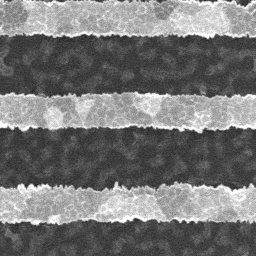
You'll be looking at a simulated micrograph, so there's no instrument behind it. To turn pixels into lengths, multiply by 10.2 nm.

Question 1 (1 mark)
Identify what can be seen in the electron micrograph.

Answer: one or a few lines or trenches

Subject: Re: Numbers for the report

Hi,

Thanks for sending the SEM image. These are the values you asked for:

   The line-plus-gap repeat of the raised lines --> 948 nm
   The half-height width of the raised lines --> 343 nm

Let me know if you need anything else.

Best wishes